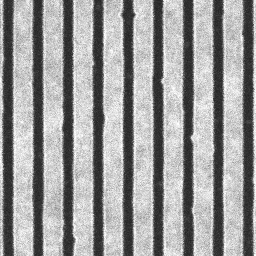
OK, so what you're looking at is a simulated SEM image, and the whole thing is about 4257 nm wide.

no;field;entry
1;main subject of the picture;parallel lines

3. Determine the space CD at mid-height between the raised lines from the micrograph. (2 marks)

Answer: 276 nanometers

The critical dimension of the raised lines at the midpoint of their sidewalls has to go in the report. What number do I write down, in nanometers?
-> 222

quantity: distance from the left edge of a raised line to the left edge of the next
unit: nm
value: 499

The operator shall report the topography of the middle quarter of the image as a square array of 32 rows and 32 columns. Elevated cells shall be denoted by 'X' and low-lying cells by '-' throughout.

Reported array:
XXX----XXX-----XXX----XXX-----XX
XXX----XXX-----XXX----XXX-----XX
XXX----XXX-----XXX----XXX-----XX
XXX----XXX-----XXX----XXX-----XX
XXX----XXX-----XXX----XXX-----XX
XXX----XXX-----XXX----XXX-----XX
XXX----XXX-----XXX----XXX----XXX
XXX----XXX-----XXX----XXX----XXX
XXX----XXX-----XXX----XXX----XXX
XXX----XXX-----XXX----XXX----XXX
XXX----XXX-----XXX----XXX----XXX
XXX----XXX-----XXX----XXX-----XX
XXX----XXX-----XXX----XXX-----XX
XXX----XXXX----XXX----XXX-----XX
XXX----XXXX----XXX----XXX-----XX
XXX----XXX-----XXX----XXX-----XX
XXX----XXX-----XXX----XXX-----XX
XXX----XXX-----XXX----XXX-----XX
XXX----XXX-----XXX----XXX-----XX
XXX----XXX-----XXX----XXX-----XX
XXX----XXX-----XXX----XXX-----XX
XXX----XXX-----XXX----XXX-----XX
XXX----XXX-----XXX----XXX-----XX
XXX----XXX-----XXX----XXX-----XX
XXX----XXX-----XXX----XXX-----XX
XXX----XXX-----XXX----XXX-----XX
XXX----XXX-----XXX----XXX-----XX
XXX----XXX-----XXX----XXX-----XX
XXX----XXX-----XXX----XXX-----XX
XXX----XXX-----XXX----XXX-----XX
XXX----XXX-----XXX----XXX-----XX
XXX----XXX----XXXX----XXX----XXX